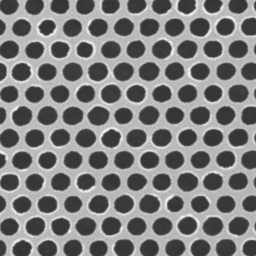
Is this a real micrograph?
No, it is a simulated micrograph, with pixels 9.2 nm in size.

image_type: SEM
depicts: a regular array of holes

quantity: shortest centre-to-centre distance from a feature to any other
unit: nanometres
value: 231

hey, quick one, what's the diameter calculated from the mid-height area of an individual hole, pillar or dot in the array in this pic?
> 176 nanometers